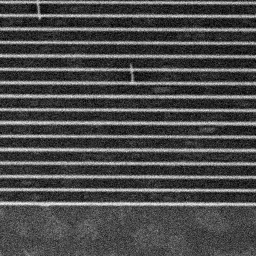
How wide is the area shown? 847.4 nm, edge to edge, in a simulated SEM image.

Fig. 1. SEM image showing parallel lines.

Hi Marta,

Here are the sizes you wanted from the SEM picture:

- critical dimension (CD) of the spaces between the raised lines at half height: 37.2 nanometers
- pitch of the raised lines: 13.4 pixels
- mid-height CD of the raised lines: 8.7 nm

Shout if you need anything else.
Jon